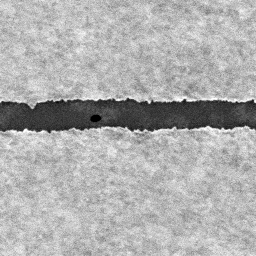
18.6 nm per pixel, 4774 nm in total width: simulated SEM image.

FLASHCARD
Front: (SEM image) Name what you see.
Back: one or a few lines or trenches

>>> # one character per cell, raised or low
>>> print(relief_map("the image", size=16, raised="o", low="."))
oooooooooooooooo
oooooooooooooooo
oooooooooooooooo
oooooooooooooooo
oooooooooooooooo
oooooooooooooooo
................
................
oooooooooooooooo
oooooooooooooooo
oooooooooooooooo
oooooooooooooooo
oooooooooooooooo
oooooooooooooooo
oooooooooooooooo
oooooooooooooooo